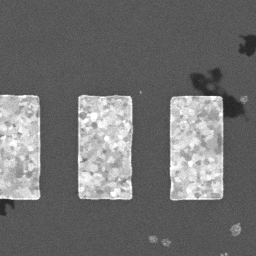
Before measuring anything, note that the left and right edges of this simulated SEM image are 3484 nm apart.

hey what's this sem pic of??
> wiring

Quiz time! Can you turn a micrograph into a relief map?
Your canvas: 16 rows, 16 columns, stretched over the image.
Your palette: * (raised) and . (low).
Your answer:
................
................
................
................
................
................
**...***...***..
**...***...***..
**...***...***..
**...***...***..
**...***...***..
**...***...***..
................
................
................
................